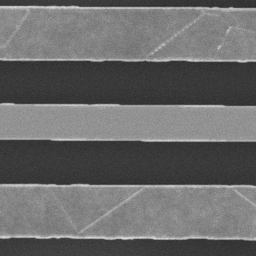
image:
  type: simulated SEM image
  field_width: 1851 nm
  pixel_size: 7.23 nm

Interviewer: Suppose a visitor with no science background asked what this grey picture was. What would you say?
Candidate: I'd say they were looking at lines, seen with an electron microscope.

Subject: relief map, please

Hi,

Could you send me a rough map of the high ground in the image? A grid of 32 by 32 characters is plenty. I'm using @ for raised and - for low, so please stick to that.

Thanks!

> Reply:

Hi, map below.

--------------------------------
@@@@@@@@@@@@@@@@@@@@@@@@@@@@@@@@
@@@@@@@@@@@@@@@@@@@@@@@@@@@@@@@@
@@@@@@@@@@@@@@@@@@@@@@@@@@@@@@@@
@@@@@@@@@@@@@@@@@@@@@@@@@@@@@@@@
@@@@@@@@@@@@@@@@@@@@@@@@@@@@@@@@
@@@@@@@@@@@@@@@@@@@@@@@@@@@@@@@@
----@@@@@@@@@@@@@@@@@@@@@@@@@@@@
--------------------------------
--------------------------------
--------------------------------
--------------------------------
--------------------------------
@@@@@@@@@@@@@@@@@@@@@@@@@@@@@@@@
@@@@@@@@@@@@@@@@@@@@@@@@@@@@@@@@
@@@@@@@@@@@@@@@@@@@@@@@@@@@@@@@@
@@@@@@@@@@@@@@@@@@@@@@@@@@@@@@@@
------------------@@@@@@@@@@@@@@
--------------------------------
--------------------------------
--------------------------------
--------------------------------
--------------------------------
@@@@@@@@@@@@@@@@@@@@@@@@@@@@@@@@
@@@@@@@@@@@@@@@@@@@@@@@@@@@@@@@@
@@@@@@@@@@@@@@@@@@@@@@@@@@@@@@@@
@@@@@@@@@@@@@@@@@@@@@@@@@@@@@@@@
@@@@@@@@@@@@@@@@@@@@@@@@@@@@@@@@
@@@@@@@@@@@@@@@@@@@@@@@@@@@@@@@@
@@@@@@@@@@@@@@@@@@@@@@@@@@@@@@@@
--------------------------------
--------------------------------